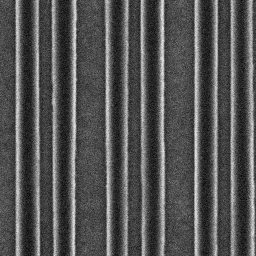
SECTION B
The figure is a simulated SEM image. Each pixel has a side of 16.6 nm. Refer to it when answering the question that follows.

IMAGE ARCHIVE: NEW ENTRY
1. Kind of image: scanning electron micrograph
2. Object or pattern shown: lines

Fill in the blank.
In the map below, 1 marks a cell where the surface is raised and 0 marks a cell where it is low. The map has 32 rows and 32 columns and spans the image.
00111001100001110011000001100110
00111001100001110011000001100110
00111001100001110011000001100110
00111001100001110011000001100110
00111001100001110011000001100110
00111001100001110011000001100110
00111001100001110011000001100110
00111001100001110011000001100110
00111001100001110011000001100110
00111001100001110011000001100110
00111001100001110011000001100110
00111001100001110011000001100110
00111001100001110011000001100110
00111001100001110011000001100110
00111001100001110011000011100110
00111001100001110011000011100110
00111001100001110011000011100110
00111001100001110011000011100110
00111001100001110011000011100110
00111001100001110011000011100110
00111001100001110011000011100111
00111001100001110011000011100111
00111001100001110011000011100111
00111001100001110011000011100111
00111001100001110011000011100111
00111001100000110011000011100111
00111001100000110011000011100111
00111001100000110011000011100111
00111001100000110011000011100111
00111001100000110011000001100111
00111001100000110011000001100111
00111001100000110011000001100111